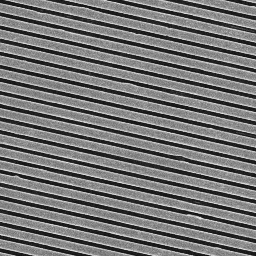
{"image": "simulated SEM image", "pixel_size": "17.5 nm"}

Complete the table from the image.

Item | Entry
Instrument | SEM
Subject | parallel lines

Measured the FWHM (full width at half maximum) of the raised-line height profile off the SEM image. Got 0.165 µm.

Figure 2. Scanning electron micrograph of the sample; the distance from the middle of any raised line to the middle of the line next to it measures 224 nm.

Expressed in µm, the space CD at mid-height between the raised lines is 0.0599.